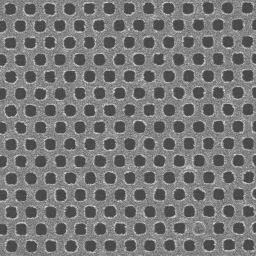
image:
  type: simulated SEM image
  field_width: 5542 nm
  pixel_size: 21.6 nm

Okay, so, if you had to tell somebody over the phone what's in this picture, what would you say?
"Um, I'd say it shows a regular array of holes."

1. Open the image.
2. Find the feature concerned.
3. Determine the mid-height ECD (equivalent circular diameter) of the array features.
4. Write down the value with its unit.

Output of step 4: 262 nm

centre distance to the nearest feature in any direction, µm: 0.418